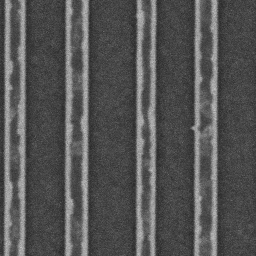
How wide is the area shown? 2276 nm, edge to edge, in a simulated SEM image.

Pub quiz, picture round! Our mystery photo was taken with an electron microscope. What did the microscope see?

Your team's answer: one or a few lines or trenches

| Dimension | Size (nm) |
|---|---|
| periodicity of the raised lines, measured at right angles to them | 566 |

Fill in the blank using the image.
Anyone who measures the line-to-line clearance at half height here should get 394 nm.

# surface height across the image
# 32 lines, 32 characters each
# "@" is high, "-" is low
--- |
-@@------@@------@@------@@-----
-@@------@@------@@------@@-----
-@@------@@------@@------@@-----
-@@------@@-------@------@@-----
-@@------@@-------@------@@-----
-@@------@@------@@------@@-----
-@@------@@------@@------@@-----
-@@------@@------@@------@@-----
-@@------@@------@@------@@-----
-@@------@@------@@------@@-----
-@@------@@------@@------@@-----
-@@------@@------@@------@@-----
-@@------@@------@@------@@-----
-@@------@@------@@------@@-----
-@@------@@-------@------@@-----
-@@------@@------@@------@@-----
-@@-----@@@------@@------@@-----
-@@-----@@@------@@------@@-----
-@@-----@@@------@@------@@-----
-@@-----@@@------@@------@@-----
-@@-----@@@------@@------@@-----
-@@-----@@@------@@------@@-----
-@@-----@@@------@@------@@-----
-@@-----@@@------@@------@@-----
-@@------@@------@@------@@-----
-@@------@@------@@------@@-----
-@@------@@------@@------@@-----
-@@------@@------@@------@@-----
-@@------@@------@@------@@-----
-@@------@@------@@------@@-----
-@@------@@------@@------@@-----
-@@-----@@@------@@------@@-----